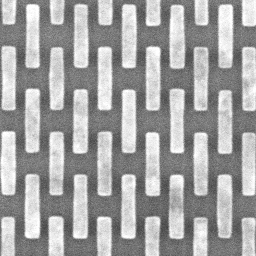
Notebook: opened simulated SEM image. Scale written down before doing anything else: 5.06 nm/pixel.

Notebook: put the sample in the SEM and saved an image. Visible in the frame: groups of lines, slits or small figures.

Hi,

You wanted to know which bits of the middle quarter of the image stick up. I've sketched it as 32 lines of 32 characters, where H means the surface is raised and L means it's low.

LLLHHHLLLHHHLLLHHHLLLHHHLLLHHHLL
LLLLLLLLLHHHLLLLLLLLLHHHLLLLLLLL
LLLLLLLLLHHHLLLLLLLLLHHHLLLLLLLL
LLLLLLLLLHHHLLLLLLLLLHHHLLLLLLLL
LLLLLLLLLHHHLLLLLLLLLHHHLLLLLLLL
LLLLLLLLLHHHLLLLLLLLLHHHLLLLLLLL
LLLLLLLLLHHHLLLLLLLLLHHHLLLHHLLL
LLLHHHLLLHHHLLLHHHLLLHHHLLLHHHLL
LLLHHHLLLHHHLLLHHHLLLHHHLLLHHHLL
LLLHHHLLLHHHLLLHHHLLLHHHLLLHHHLL
LLLHHHLLLHHHLLLHHHLLLHHHLLLHHHLL
LLLHHHLLLLLLLLLHHHLLLLLLLLLHHHLL
LLLHHHLLLLLLLLLHHHLLLLLLLLLHHHLL
LLLHHHLLLLLLLLLHHHLLLLLLLLLHHHLL
LLLHHHLLLLLLLLLHHHLLLLLLLLLHHHLL
LLLHHHLLLLLLLLLHHHLLLLLLLLLHHHLL
LLLHHHLLLLLLLLLHHHLLLLLLLLLHHHLL
LLLHHHLLLHHHLLLHHHLLLHHLLLLHHHLL
LLHHHHLLLHHHLLLHHHLLLHHLLLLHHHLL
LLHHHHLLLHHHLLLHHHLLLHHLLLLHHHLL
LLHHHHLLLHHHLLLHHHLLLHHLLLLHHHLL
LLHHHHLLLHHHLLLHHHLLLHHLLLLHHHLL
LLLLLLLLLHHHLLLLLLLLLHHLLLLLLLLL
LLLLLLLLLHHHLLLLLLLLLHHLLLLLLLLL
LLLLLLLLLHHHLLLLLLLLLHHHLLLLLLLL
LLLLLLLLLHHHLLLLLLLLLHHHLLLLLLLL
LLLLLLLLLHHHLLLLLLLLLHHHLLLLLLLL
LLLLLLLLLHHHLLLLLLLLLHHHLLLLLLLL
LLLHHHLLLHHHLLLHHHLLLHHHLLLHHHLL
LLLHHHLLLHHHLLLHHHLLLHHHLLLHHHLL
LLLHHHLLLHHHLLLHHHLLLHHHLLLHHHLL
LLLHHHLLLHHHLLLHHHLLLHHHLLLHHHLL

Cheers